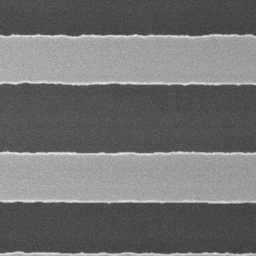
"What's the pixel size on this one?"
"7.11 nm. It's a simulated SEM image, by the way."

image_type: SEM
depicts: lines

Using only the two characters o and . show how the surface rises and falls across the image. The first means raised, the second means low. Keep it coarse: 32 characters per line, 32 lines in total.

................................
................................
................................
................................
ooooooooo.oooooooooooooo.ooooooo
oooooooooooooooooooooooooooooooo
oooooooooooooooooooooooooooooooo
oooooooooooooooooooooooooooooooo
oooooooooooooooooooooooooooooooo
oooooooooooooooooooooooooooooooo
.........oo..........ooo..oo.o.o
................................
................................
................................
................................
................................
................................
................................
................................
oooooooooooooooooooooooooooooooo
oooooooooooooooooooooooooooooooo
oooooooooooooooooooooooooooooooo
oooooooooooooooooooooooooooooooo
oooooooooooooooooooooooooooooooo
oooooooooooooooooooooooooooooooo
................................
................................
................................
................................
................................
................................
................................